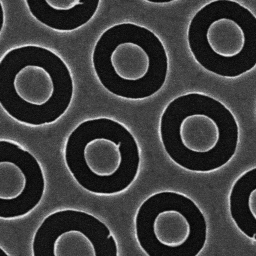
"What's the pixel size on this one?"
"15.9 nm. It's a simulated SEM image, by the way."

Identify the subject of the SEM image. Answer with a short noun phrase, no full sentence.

ring-shaped grooves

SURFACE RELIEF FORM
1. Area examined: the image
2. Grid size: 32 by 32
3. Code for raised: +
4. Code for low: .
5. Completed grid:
+++...++++..++++++++++++++....++
++++........+++++++++++++......+
+++++......+++++++++++++...++...
+++++++...++++....++++++..++++..
+++++++++++++......+++++..++++..
++++++++++++...++...++++..++++..
+.....++++++..++++...+++...+++..
........++++..+++++..++++.......
...++...++++..++++...+++++.....+
..++++...+++...+++...+++++++..++
..+++++..++++.......++++++++++++
..+++++..+++++.....+++++++++++++
...+++...+++++++++++++.....+++++
........+++++++++++++.......++++
+......+++++++++++++....++...+++
+++..+++++.....+++++...++++...++
+++++++++.......++++...++++...++
+++++++++...+....+++...++++...++
...+++++...++++..++++...++...+++
....++++...++++..++++........+++
++...+++...++++..+++++......++++
+++..++++...++...++++++++++++++.
+++...++++.......+++++++++++++..
+++...+++++.....+++++++++++++...
++...++++++++++++++....++++++..+
.....+++++++++++++......+++++..+
....+++...+++++++....+...++++..+
++++++......+++++...+++...+++...
+++++........++++..+++++..++++..
++++....+++...+++...+++...+++++.
++++...++++....++....+....++++++
.+++...+++++...+++.......+++++++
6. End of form